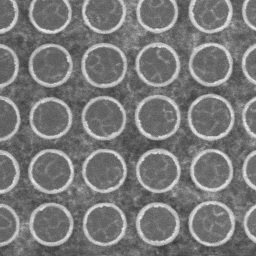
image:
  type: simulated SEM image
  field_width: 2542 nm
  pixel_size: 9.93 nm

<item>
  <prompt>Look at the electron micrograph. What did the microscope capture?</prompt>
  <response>a regular array of raised bodies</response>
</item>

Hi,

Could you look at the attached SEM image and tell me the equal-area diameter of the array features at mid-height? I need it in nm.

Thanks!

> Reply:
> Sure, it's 414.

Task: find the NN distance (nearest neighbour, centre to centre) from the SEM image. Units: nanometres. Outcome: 527